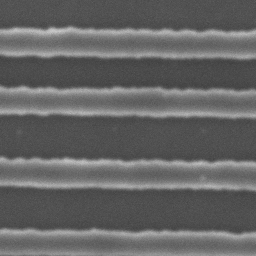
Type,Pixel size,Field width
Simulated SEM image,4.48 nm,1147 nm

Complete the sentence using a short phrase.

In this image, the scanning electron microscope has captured lines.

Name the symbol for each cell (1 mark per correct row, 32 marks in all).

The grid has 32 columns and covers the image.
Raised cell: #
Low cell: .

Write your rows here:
................................
................................
................................
................................
################################
################################
################################
................................
................................
................................
................................
################################
################################
################################
...................##......#####
................................
................................
................................
................................
................................
################################
################################
################################
................##...#..#.######
................................
................................
................................
................................
................................
################################
################################
################################